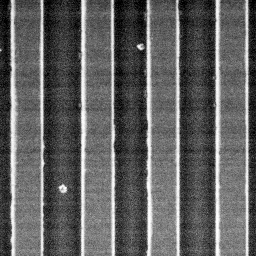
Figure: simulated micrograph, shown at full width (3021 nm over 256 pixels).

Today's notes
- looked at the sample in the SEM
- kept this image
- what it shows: lines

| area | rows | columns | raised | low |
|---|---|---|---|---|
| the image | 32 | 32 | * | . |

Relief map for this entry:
..***.....****....****.....****.
..***.....****.....***.....****.
..***.....****.....***.....****.
..***.....****.....***.....****.
..***.....****.....***.....****.
..***.....****.....***.....****.
..***.....****.....***.....****.
..***.....****.....***.....****.
..***.....****.....***.....****.
..***.....****.....***.....****.
..***.....****.....***.....****.
..***.....****.....***.....****.
..***.....****.....***.....****.
..***.....****.....***.....****.
..***.....****.....***.....****.
..***.....****.....***.....****.
..***.....****.....***.....****.
..***.....****.....***.....****.
..***.....****.....***.....****.
..***.....****.....***.....****.
..***.....****.....***.....****.
..***.....****.....***.....****.
..***.....****.....***.....****.
..***.....****.....***.....****.
..***.....****.....***.....****.
..***.....****.....***.....****.
..***.....****.....***.....****.
..***.....****.....***.....****.
..***.....****.....***.....****.
..***.....****.....***.....****.
..***.....****.....***.....****.
..***.....****.....***.....****.